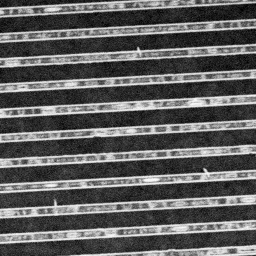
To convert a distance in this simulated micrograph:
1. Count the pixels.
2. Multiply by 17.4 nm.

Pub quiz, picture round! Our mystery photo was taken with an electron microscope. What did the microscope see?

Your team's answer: parallel lines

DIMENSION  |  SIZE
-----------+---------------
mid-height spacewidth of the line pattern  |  307 nanometres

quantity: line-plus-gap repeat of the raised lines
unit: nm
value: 438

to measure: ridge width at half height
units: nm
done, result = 133